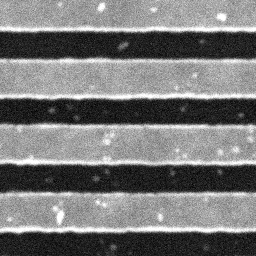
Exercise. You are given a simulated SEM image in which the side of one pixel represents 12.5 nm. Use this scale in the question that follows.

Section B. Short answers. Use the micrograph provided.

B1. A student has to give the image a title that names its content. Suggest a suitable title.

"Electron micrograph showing lines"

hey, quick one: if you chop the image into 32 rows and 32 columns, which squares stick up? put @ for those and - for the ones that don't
@@@@@@@@@@@@@@@@@@@@@@@@@@@@@@@@
@@@@@@@@@@@@@@@@@@@@@@@@@@@@@@@@
@@@@@@@@@@@@@@@@@@@@@@@@@@@@@@@@
@@@@@@@@@@@@@@@@@@@@@@@@@@@@@@@@
--------------------------------
--------------------------------
--------------------------------
--------------------------------
@@@@@@@@@@@@@@@@@@@@@@@@@@@@@@@@
@@@@@@@@@@@@@@@@@@@@@@@@@@@@@@@@
@@@@@@@@@@@@@@@@@@@@@@@@@@@@@@@@
@@@@@@@@@@@@@@@@@@@@@@@@@@@@@@@@
--------------------------------
--------------------------------
--------------------------------
--------------------------------
@@@@@@@@@@@@@@@@@@@@@@@@@@@@@@@@
@@@@@@@@@@@@@@@@@@@@@@@@@@@@@@@@
@@@@@@@@@@@@@@@@@@@@@@@@@@@@@@@@
@@@@@@@@@@@@@@@@@@@@@@@@@@@@@@@@
--@-@------@@@@---@@@@@-@@@@@@@-
--------------------------------
--------------------------------
--------------------------------
@@@@@@@@@@@@@@@@@@@@@@@@@@@@@@@@
@@@@@@@@@@@@@@@@@@@@@@@@@@@@@@@@
@@@@@@@@@@@@@@@@@@@@@@@@@@@@@@@@
@@@@@@@@@@@@@@@@@@@@@@@@@@@@@@@@
@@@@@@@@@@@@@@@@@@@@@@@@@@@@@@@@
--------------------------------
--------------------------------
--------------------------------